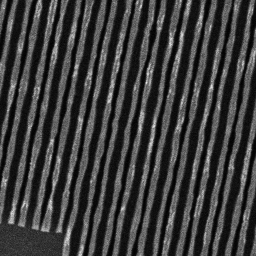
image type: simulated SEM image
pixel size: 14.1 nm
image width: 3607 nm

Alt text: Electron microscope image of parallel lines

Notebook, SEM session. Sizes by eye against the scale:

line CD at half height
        6.01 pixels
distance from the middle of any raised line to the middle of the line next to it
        0.172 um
